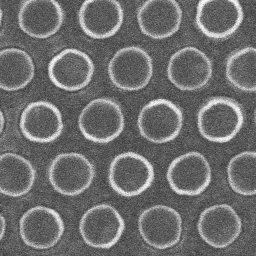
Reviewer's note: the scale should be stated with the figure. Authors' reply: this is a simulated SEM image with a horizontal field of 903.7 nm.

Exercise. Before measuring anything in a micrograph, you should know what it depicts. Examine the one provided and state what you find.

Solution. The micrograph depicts a regular array of raised bodies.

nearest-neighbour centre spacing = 208 nanometres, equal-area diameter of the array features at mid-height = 149 nm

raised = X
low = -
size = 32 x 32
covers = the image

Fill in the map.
---XXXX---XXXXX---XXXX---XXXXX--
---XXXXX--XXXXX--XXXXX---XXXXX--
--XXXXXX--XXXXX--XXXXX---XXXXX--
---XXXX---XXXXX---XXXX---XXXXX--
----XX-----XXX-----XX-----XX----
--------------------------------
XXX-----XX-----XXX----XXX-----XX
XXXX---XXXX---XXXXX--XXXXX---XXX
XXXX--XXXXXX--XXXXX--XXXXX--XXXX
XXXX--XXXXX---XXXXX--XXXXX--XXXX
XXX----XXXX---XXXX----XXX----XXX
--------------------------------
-------------------XX------X----
---XXXX----XXXX---XXXX---XXXXX--
---XXXXX--XXXXX---XXXXX--XXXXX--
---XXXXX--XXXXX--XXXXXX--XXXXX--
---XXXX---XXXXX---XXXX---XXXXX--
----XX-----XXX-----XX-----XXX---
--------------------------------
XX-----XXX-----XXX-----XX-----XX
XXXX---XXXX---XXXXX--XXXXX---XXX
XXXX--XXXXXX--XXXXX--XXXXX---XXX
XXXX--XXXXX---XXXXX--XXXXX---XXX
XXXX---XXXX---XXXX----XXXX---XXX
--------------------------------
--------------------------------
----XXX----XXXX---XXXX----XXX---
---XXXXX--XXXXX--XXXXX---XXXXX--
X--XXXXX--XXXXX--XXXXX---XXXXX--
---XXXXX--XXXXX---XXXX---XXXXX--
----XXX----XXX-----XXX----XXX---
--------------------------------